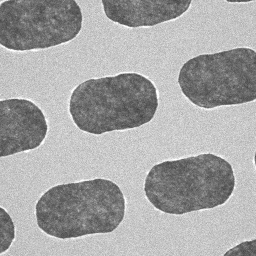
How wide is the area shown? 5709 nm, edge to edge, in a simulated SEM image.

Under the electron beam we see holes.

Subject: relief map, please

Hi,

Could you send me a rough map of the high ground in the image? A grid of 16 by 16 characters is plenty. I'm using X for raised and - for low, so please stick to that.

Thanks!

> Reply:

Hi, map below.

-----X------XXXX
-----XXX--XXXXXX
----XXXXXXXXXXXX
XXXXXXXXXXXX----
XXXXXXXXXXX-----
XXXXX-----X-----
--XX------XX---X
---XX----XXXXXXX
---XXXXXXXXXXXXX
-XXXXXXXXXXXXXXX
XXXXXXXXXX----XX
XXXX---XX------X
XX------X-----XX
-X------XXXXXXXX
-XX----XXXXXXXXX
XXXXXXXXXXXXXXX-